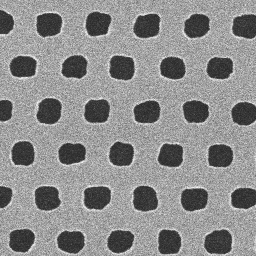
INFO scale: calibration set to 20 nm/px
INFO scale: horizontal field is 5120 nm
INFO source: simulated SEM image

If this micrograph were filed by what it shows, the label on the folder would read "a regular array of holes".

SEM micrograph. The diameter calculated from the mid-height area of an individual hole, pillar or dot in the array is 514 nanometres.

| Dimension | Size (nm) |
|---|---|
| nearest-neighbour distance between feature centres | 978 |